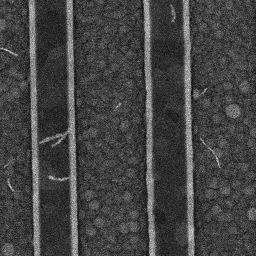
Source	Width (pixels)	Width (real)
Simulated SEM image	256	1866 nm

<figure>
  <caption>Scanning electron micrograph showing one or a few lines or trenches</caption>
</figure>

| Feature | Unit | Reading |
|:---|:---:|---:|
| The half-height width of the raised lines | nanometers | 277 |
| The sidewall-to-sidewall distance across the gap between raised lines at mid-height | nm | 567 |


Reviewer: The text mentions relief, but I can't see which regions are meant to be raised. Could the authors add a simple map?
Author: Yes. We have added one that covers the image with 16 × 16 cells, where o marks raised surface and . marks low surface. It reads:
..oo.....ooo....
..oo.....ooo....
..oo.....ooo....
..oo.....ooo....
..oo.....ooo....
..oo.....ooo....
..oo.....ooo....
..oo.....ooo....
..oo.....ooo....
..ooo....ooo....
..ooo....ooo....
..ooo....ooo....
..ooo....ooo....
..ooo....ooo....
..ooo....ooo....
..ooo.....oo....